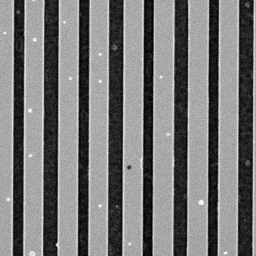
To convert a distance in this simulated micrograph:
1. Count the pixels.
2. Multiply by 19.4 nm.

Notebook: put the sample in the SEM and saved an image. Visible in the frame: parallel lines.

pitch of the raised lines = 32.4 pixels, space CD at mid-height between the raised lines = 12.5 px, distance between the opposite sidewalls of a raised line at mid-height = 19 pixels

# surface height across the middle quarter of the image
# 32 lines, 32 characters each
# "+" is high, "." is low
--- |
+++...+++++....+++++..+++++....+
++++..+++++....+++++..+++++....+
+++...+++++....+++++..+++++....+
+++...+++++....+++++..+++++....+
+++...+++++....+++++..+++++....+
+++...+++++....+++++..+++++....+
++++..+++++....+++++..+++++....+
++++..+++++....+++++..+++++....+
++++..+++++....+++++..+++++....+
++++..+++++....+++++..+++++....+
++++..+++++....+++++..+++++....+
++++..+++++....+++++..+++++....+
++++..+++++....+++++..+++++....+
+++...+++++....+++++..+++++....+
+++...+++++....+++++..+++++....+
++++..+++++....+++++..+++++....+
++++..+++++....+++++..+++++....+
++++..+++++....+++++..+++++....+
++++..+++++....+++++..+++++....+
++++..+++++....+++++..+++++....+
++++..+++++....+++++..+++++....+
++++..+++++....+++++..+++++....+
++++..+++++....+++++..+++++....+
+++...+++++....+++++..+++++....+
+++...+++++....++++...+++++....+
+++...+++++....++++...+++++....+
+++...+++++....+++++..+++++....+
+++...+++++....++++...+++++....+
+++...+++++....++++...+++++....+
+++...+++++....++++...+++++....+
+++...+++++....++++...+++++....+
+++...+++++....++++...+++++....+